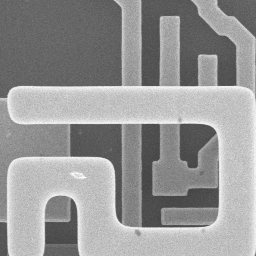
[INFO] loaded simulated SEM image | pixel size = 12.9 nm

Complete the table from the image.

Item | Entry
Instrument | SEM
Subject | wiring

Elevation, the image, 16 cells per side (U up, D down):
DDDDDDDDDDDDDDDD
DDDDDDDDDDDDDDDD
DDDDDDDDDDDDDDDD
DDDDDDDDDDDDDDDD
DDDDDDDDDDDDDDDD
DUUUUUUUUUUUUUUD
UUUUUUUUUUUUUUUU
DUUUUUUUUUUUUUUU
DDDDDDDDDDDDDDUU
DDDDDDDDDDDDDDUU
DUUUUUUDDDDDDDUU
UUUUUUUDDDDDDDUU
UUUDUUUDDDDDDDUU
UUUDDUUDDDDDDDUU
UUUDDUUUUUUUUUUU
UUUDDUUUUUUUUUUU